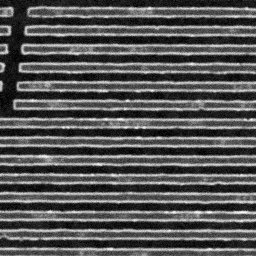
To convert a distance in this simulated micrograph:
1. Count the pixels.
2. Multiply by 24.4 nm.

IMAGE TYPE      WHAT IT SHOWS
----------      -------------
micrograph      parallel lines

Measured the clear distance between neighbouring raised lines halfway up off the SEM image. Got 260 nm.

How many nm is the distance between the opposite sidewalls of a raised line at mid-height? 196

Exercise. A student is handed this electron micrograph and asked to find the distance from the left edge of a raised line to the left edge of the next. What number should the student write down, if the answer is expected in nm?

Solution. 453